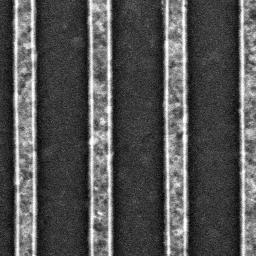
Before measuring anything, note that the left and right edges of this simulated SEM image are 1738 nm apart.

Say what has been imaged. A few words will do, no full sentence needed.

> one or a few lines or trenches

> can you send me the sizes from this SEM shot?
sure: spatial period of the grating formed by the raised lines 75.4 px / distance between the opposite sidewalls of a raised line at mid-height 118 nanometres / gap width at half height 397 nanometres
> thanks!